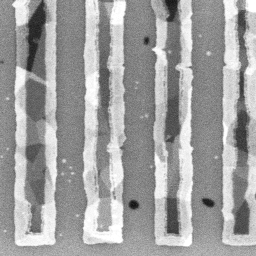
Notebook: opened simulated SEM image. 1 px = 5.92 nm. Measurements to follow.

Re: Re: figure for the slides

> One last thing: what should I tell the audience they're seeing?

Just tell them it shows one or a few lines or trenches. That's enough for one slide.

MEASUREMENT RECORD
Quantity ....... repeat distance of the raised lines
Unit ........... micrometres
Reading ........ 0.406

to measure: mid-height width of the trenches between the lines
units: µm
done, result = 0.235